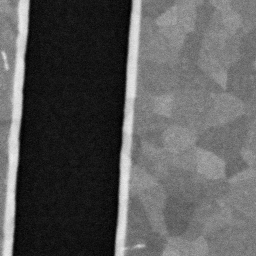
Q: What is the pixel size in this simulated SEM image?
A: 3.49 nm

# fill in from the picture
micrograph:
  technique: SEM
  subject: one or a few lines or trenches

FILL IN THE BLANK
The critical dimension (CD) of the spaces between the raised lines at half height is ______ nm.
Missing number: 394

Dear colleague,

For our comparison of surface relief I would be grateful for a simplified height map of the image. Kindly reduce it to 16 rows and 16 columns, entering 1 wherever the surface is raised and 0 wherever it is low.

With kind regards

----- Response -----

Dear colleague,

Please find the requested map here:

1000000001111111
1000000011111111
1000000011111111
1000000011111111
1000000011111111
1000000011111111
1000000011111111
1000000011111111
1000000011111111
1000000011111111
1000000011111111
1000000011111111
1000000011111111
1000000011111111
1000000011111111
0000000011111111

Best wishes